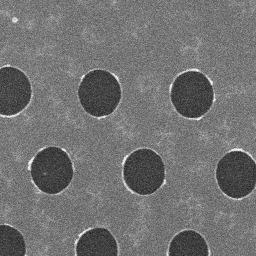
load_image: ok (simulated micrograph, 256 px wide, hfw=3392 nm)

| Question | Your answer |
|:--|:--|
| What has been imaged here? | holes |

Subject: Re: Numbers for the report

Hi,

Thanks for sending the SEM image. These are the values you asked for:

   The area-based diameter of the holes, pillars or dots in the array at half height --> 45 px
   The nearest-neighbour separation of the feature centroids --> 1200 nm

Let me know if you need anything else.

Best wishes